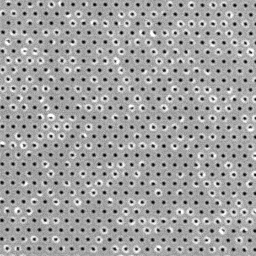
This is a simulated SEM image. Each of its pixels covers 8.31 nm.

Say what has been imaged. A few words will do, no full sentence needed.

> a regular array of holes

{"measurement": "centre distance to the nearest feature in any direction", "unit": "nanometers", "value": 87.2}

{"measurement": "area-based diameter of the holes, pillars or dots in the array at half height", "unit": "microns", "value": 0.0311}